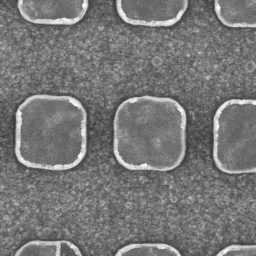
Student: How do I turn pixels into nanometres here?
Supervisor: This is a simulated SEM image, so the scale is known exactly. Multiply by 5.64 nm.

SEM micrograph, raised bodies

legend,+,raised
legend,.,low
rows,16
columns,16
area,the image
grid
.++++..+++++.+++
...+.....++...++
................
................
................
................
.++++...+++...++
.++++..+++++.+++
.++++..+++++.+++
.++++..++++..+++
...+....+++...++
................
................
................
................
.++++...+++...++